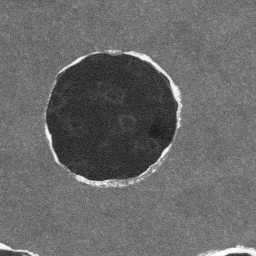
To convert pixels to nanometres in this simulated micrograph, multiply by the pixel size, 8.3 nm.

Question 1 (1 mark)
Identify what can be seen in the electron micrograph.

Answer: holes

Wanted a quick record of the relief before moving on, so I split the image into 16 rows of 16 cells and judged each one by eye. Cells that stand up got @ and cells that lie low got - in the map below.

@@@@@@@@@@@@@@@@
@@@@@@@@@@@@@@@@
@@@@@@@@@@@@@@@@
@@@@@@---@@@@@@@
@@@@------@@@@@@
@@@--------@@@@@
@@@--------@@@@@
@@@--------@@@@@
@@@--------@@@@@
@@@-------@@@@@@
@@@@-----@@@@@@@
@@@@@@@@@@@@@@@@
@@@@@@@@@@@@@@@@
@@@@@@@@@@@@@@@@
@@@@@@@@@@@@@@@@
@@@@@@@@@@@@@@@@